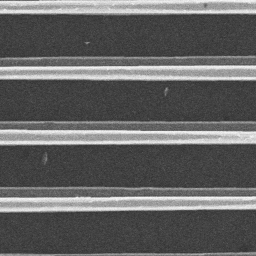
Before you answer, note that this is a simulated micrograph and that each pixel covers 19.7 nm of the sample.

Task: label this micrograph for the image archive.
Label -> lines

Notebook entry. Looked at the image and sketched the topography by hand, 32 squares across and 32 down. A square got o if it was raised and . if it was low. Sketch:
oooooooooooooooooooooooooooooooo
oooooooooooooooooooooooooooooooo
................................
................................
................................
................................
................................
oooooooooooooooooooooooooooooooo
oooooooooooooooooooooooooooooooo
oooooooooooooooooooooooooooooooo
................................
................................
................................
................................
................................
oooooooooooooooooooooooooooooooo
oooooooooooooooooooooooooooooooo
oooooooooooooooooooooooooooooooo
................................
................................
................................
................................
................................
................................
oooooooooooooooooooooooooooooooo
oooooooooooooooooooooooooooooooo
................................
................................
................................
................................
................................
................................